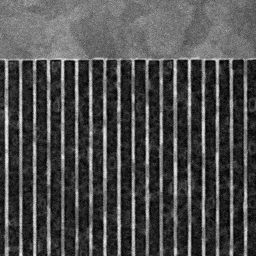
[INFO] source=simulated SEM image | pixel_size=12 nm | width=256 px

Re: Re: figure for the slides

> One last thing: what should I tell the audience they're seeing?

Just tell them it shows parallel lines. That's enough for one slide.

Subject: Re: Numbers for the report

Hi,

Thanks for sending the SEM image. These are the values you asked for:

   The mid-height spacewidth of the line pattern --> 143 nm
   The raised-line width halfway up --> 2.13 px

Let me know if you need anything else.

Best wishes